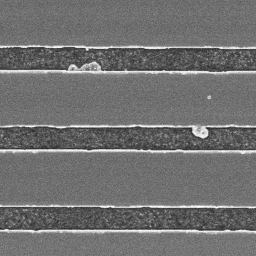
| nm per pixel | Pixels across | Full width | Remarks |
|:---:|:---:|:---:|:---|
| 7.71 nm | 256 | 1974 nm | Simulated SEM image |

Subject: lines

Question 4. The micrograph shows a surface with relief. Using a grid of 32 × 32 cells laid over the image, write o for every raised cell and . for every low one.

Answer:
oooooooooooooooooooooooooooooooo
oooooooooooooooooooooooooooooooo
oooooooooooooooooooooooooooooooo
oooooooooooooooooooooooooooooooo
oooooooooooooooooooooooooooooooo
oooooooooooooooooooooooooooooooo
................................
................................
................................
oooooooooooooooooooooooooooooooo
oooooooooooooooooooooooooooooooo
oooooooooooooooooooooooooooooooo
oooooooooooooooooooooooooooooooo
oooooooooooooooooooooooooooooooo
oooooooooooooooooooooooooooooooo
oooooooooooooooooooooooooooooooo
........................oo......
................................
................................
oooooooooooooooooooooooooooooooo
oooooooooooooooooooooooooooooooo
oooooooooooooooooooooooooooooooo
oooooooooooooooooooooooooooooooo
oooooooooooooooooooooooooooooooo
oooooooooooooooooooooooooooooooo
oooooooooooooooooooooooooooooooo
................................
................................
................................
oooooooooooooooooooooooooooooooo
oooooooooooooooooooooooooooooooo
oooooooooooooooooooooooooooooooo